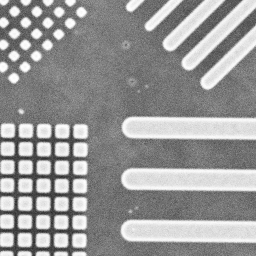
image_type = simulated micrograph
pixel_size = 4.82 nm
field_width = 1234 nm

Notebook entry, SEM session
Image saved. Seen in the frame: groups of lines, slits or small figures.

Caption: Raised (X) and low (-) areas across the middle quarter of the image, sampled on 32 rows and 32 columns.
------------------------------XX
--------------------------------
--------------------------------
--------------------------------
--------------------------------
--------------------------------
--------------------------------
--------------------------------
--------------------------------
--------------------------------
--------------------------------
--------------------------------
--------------------------------
----------------XXXXXXXX--------
---------------XXXXXXXXXXXXXXXXX
X--XX----------XXXXXXXXXXXXXXXXX
X--XXX---------XXXXXXXXXXXXXXXXX
X--XXX---------XXXXXXXXXXXXXXXXX
--------------------------XXXXXX
--------------------------------
X-XXXX--------------------------
X-XXXX--------------------------
X-XXXX--------------------------
--------------------------------
X-------------------------------
X-XXXX--------------------------
X-XXXX----------XXXXXXXXXXXXXXXX
X--XX----------XXXXXXXXXXXXXXXXX
---------------XXXXXXXXXXXXXXXXX
X-XXX----------XXXXXXXXXXXXXXXXX
X-XXX----------XXXXXXXXXXXXXXXXX
X-XXX---------------------------